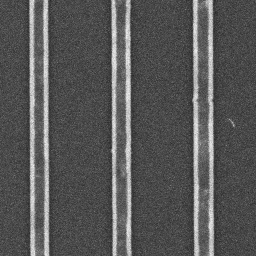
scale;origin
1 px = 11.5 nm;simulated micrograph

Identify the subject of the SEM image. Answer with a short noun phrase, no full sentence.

one or a few lines or trenches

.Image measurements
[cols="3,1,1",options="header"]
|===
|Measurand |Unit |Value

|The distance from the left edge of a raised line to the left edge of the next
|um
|0.942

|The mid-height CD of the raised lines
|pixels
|14.6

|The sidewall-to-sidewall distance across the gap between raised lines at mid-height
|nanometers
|774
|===